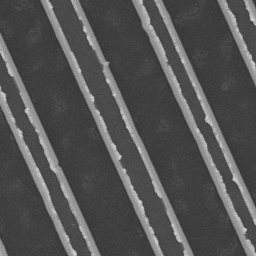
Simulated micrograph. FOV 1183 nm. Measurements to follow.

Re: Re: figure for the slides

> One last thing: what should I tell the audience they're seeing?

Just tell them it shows one or a few lines or trenches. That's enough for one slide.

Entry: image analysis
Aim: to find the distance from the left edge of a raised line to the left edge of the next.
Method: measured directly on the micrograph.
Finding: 0.374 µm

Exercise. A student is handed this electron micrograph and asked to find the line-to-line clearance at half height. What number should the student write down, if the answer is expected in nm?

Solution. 256